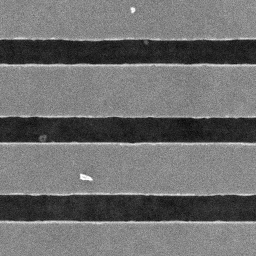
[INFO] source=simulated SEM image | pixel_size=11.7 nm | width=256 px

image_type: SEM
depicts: lines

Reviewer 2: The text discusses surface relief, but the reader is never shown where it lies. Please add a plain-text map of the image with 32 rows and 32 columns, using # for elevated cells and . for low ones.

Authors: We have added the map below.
################################
################################
################################
################################
################################
................................
................................
................................
################################
################################
################################
################################
################################
################################
################################
................................
................................
................................
################################
################################
################################
################################
################################
################################
................................
................................
................................
................................
################################
################################
################################
################################